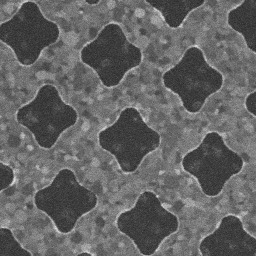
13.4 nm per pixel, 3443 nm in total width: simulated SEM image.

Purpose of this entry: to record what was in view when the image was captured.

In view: holes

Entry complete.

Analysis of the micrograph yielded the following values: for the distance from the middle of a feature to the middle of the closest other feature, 1150 nm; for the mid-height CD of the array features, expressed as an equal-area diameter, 726 nm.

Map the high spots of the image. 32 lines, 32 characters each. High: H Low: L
HHHLLHHHHHHLHHHHHHHLLLLLLHHHHHLL
HHLLLHHHHHHHHHHHHHHHLLLLHHHHHLLL
HLLLLLHHHHHHHHHHHHHHHLLHHHHHLLLL
LLLLLLLHHHHHHLLHHHHHHHHHHHHHHLLL
LLLLLLLHHHHHLLLLHHHHHHHHHHHHHHLL
HLLLLLLHHHHLLLLLLHHHHHHHHHHHHHHL
HHLLLHHHHHLLLLLLLLHHHHHLLHHHHHHH
HHLLLHHHHHLLLLLLLLHHHHLLLLHHHHHH
HHHHHHHHHHHLLLLLLHHHHLLLLLLHHHHH
HHHHHHHHHHHHLLLLHHHHLLLLLLLLHHHH
HHHHHHHHHHHHHLLHHHHHLLLLLLLLHHHH
HHHHHLLHHHHHHHHHHHHHHHLLLLLHHHHH
HHHHLLLLHHHHHHHHHHHHHHHLLLHHHHHL
HHHLLLLLLHHHHHHHLHHHHHHLLHHHHHHL
HHLLLLLLLLHHHHHLLLHHHHHHHHHHHHHH
HHHLLLLLLHHHHHLLLLHHHHHHHHHHHHHH
HHHHLLLLHHHHHLLLLLLLHHHHHHHHHHHH
HHHHLLLHHHHHLLLLLLLLHHHHHLLLHHHH
HHHHHLHHHHHHHLLLLLLLHHHHLLLLLHHH
HHHHHHHHHHHHHHLLLLHHHHHLLLLLLLHH
LHHHHHHHHHHHHHHLLHHHHHHLLLLLLLHH
LLHHHHHLLHHHHHHHHHHHHHHLLLLLLLHH
LLHHHHHLLLHHHHHHHHHHHHHHHLLLLHHH
LHHHHLLLLLLHHHHHHHHHHHHHHLLLHHHH
HHHHLLLLLLLLHHHHHLLLHHHHHHLHHHHH
HHHHLLLLLLLLHHHHHLLLHHHHHHHHHHHH
HHHHHLLLLLLHHHHLLLLLLHHHHHHHHHHH
HHHHHHLLLLHHHHHLLLLLLLHHHHHHLLHH
LHHHHHHLLHHHHHHLLLLLLLHHHHHLLLLH
LLHHHHHHHHHHHHHHLLLLLHHHHHLLLLLL
LLLHHHHHHHHHHHHHHLLLHHHHHLLLLLLL
LLLLHHHHHHHHHHHHHHLHHHHHHLLLLLLL